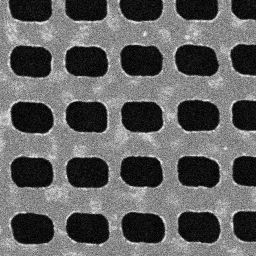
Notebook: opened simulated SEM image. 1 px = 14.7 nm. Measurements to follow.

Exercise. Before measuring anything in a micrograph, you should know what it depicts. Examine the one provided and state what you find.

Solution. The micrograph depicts a regular array of holes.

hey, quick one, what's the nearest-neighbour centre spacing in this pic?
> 55.1 px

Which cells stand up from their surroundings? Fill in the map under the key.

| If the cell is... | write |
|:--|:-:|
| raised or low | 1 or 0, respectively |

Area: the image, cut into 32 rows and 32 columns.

10000001000001100000110000011000
10000001000001100000110000011000
11000011100001110001111000111111
11111111111111111111111111111111
11111111111111111111111111111111
11111111111111111111111111111111
10000011000001100000110000011000
10000011000001100000110000011000
10000011000001100000110000011000
11100011100001111001111110111111
11111111111111111111111111111111
11111111111111111111111111111111
11111111111111111111111101111111
10000011000001100000110000011000
10000001000001100000110000011000
11000001000001100000110000011000
11100011110001111001111111111111
11111111111111111111111111111111
11111111111111111111111111111111
11111111111111111011111001111111
10000011000001100000110000011000
10000001000000100000110000001000
11000001000000100000110000011000
11110111111111111111111111111111
11111111111111111111111111111111
11111111111111111111111111111111
11111111111111111111111010111100
10000011000001100000110000011000
10000001000000100000010000001000
11000001100000100000011000011100
11100111111101111111111111111111
11111111111111111111111111111111